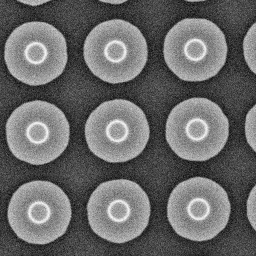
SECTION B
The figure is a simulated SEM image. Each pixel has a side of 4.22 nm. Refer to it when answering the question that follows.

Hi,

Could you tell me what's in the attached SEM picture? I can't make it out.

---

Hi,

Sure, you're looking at an array of small figures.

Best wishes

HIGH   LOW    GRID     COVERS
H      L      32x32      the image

LLLHHLLLLLLLLLLLLLLLLLLLLLLLLLLL
LLLLLLLLLLLLLLLLLLLLLLLLLLLLLLLL
LLLLLLLLLLLLLLHLLLLLLLLHHHLLLLLL
LLHHHHHLLLLLHHHHHLLLLLHHHHHLLLLH
LHHHHHHHLLLHHHHHHHLLLHHHHHHHLLLH
LHHHHHHHLLLHHHHHHHLLLHHHHHHHLLHH
LHHHHHHHLLLHHHHHHHLLHHHHHHHHLLHH
LHHHHHHHLLLHHHHHHHLLLHHHHHHHLLLH
LHHHHHHHLLLHHHHHHHLLLHHHHHHHLLLH
LLHHHHHLLLLLHHHHHLLLLLHHHHHLLLLL
LLLHHLLLLLLLLLLLLLLLLLLLLLLLLLLL
LLLLLLLLLLLLLLLLLLLLLLLLLLLLLLLL
LLLLLLLLLLLLLLHHLLLLLLLHHHLLLLLL
LLHHHHHLLLLLHHHHHLLLLLHHHHHLLLLL
LHHHHHHHLLLHHHHHHHLLLHHHHHHHLLLH
LHHHHHHHHLLHHHHHHHHLLHHHHHHHHLLH
LHHHHHHHHLLHHHHHHHHLLHHHHHHHHLLH
LHHHHHHHHLLHHHHHHHHLLHHHHHHHLLLH
LHHHHHHHLLLHHHHHHHLLLHHHHHHHLLLH
LLHHHHHLLLLLHHHHHLLLLLHHHHHLLLLL
LLLLHLLLLLLLLLLLLLLLLLLLLLLLLLLL
LLLLLLLLLLLLLLLLLLLLLLLLLLLLLLLL
LLLLLLLLLLLLLLHHLLLLLLLHHHLLLLLL
LLHHHHHLLLLLHHHHHHLLLLHHHHHHLLLL
LLHHHHHHLLLHHHHHHHLLLHHHHHHHLLLH
LHHHHHHHHLLHHHHHHHHLLHHHHHHHHLLH
LHHHHHHHHLLHHHHHHHHLLHHHHHHHHLLH
LHHHHHHHHLLHHHHHHHHLLHHHHHHHHLLH
LHHHHHHHLLLHHHHHHHLLLLHHHHHHLLLL
LLHHHHHHLLLLHHHHHLLLLLLHHHHLLLLL
LLLLHLLLLLLLLLLLLLLLLLLLLLLLLLLL
LLLLLLLLLLLLLLLLLLLLLLLLLLLLLLLL